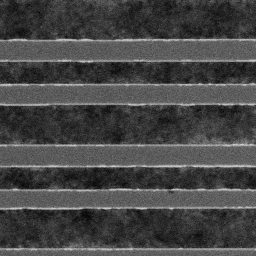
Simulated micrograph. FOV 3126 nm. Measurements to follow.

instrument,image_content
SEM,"lines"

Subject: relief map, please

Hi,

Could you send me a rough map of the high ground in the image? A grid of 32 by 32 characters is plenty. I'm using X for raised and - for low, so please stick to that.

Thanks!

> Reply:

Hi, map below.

--------------------------------
--------------------------------
--------------------------------
--------------------------------
--------------------------------
XXXXXXXXXXXXXXXXXXXXXXXXXXXXXXXX
XXXXXXXXXXXXXXXXXXXXXXXXXXXXXXXX
XXXXXXXXXXXXXXXXXXXXXXXXXXXXXXXX
--------------------------------
--------------------------------
------------------------X------X
XXXXXXXXXXXXXXXXXXXXXXXXXXXXXXXX
XXXXXXXXXXXXXXXXXXXXXXXXXXXXXXXX
--------------------------------
--------------------------------
--------------------------------
--------------------------------
--------------------------------
XXXXXXXXXXXXXXXXXXXXXXXXXXXXXXXX
XXXXXXXXXXXXXXXXXXXXXXXXXXXXXXXX
XXXXXXXXXXXXXXXXXXXXXXXXXXXXXXXX
--------------------------------
--------------------------------
--------------------------------
XXXXXXXXXXXXXXXXXXXXXXXXXXXXXXXX
XXXXXXXXXXXXXXXXXXXXXXXXXXXXXXXX
--------------------------------
--------------------------------
--------------------------------
--------------------------------
--------------------------------
XXXXXXXXXXXXXXXXXXXXXXXXXXXXXXXX